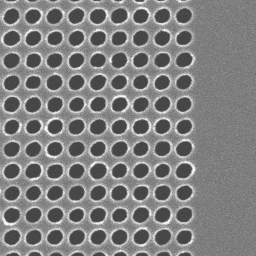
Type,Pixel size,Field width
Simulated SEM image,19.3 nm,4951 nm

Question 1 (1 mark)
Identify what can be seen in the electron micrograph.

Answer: a regular array of holes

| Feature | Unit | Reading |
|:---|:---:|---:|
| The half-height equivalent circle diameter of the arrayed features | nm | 298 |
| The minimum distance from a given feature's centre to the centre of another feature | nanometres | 414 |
